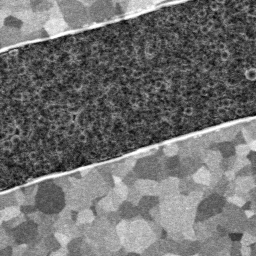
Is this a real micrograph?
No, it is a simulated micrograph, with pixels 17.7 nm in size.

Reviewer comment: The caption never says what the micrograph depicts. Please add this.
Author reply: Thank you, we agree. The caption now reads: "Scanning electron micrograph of one or a few lines or trenches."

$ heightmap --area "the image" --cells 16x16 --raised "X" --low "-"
XXXXXXXXXX------
XXXXXX----------
XXX-------------
----------------
----------------
----------------
----------------
---------------X
------------XXXX
---------XXXXXXX
-----XXXXXXXXXXX
--XXXXXXXXXXXXXX
XXXXXXXXXXXXXXXX
XXXXXXXXXXXXXXXX
XXXXXXXXXXXXXXXX
XXXXXXXXXXXXXXXX